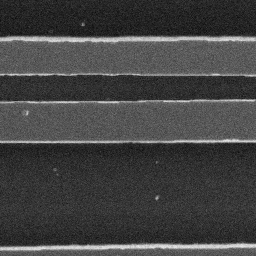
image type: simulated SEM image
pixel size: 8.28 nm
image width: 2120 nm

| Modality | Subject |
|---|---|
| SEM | lines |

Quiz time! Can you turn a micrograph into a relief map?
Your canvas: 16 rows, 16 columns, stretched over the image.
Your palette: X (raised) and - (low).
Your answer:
----------------
----------------
----------------
XXXXXXXXXXXXXXXX
XXXXXXXXXXXXXXXX
XXXXXXXXXXXXXXXX
XXXXXXXXXXXXXXXX
XXXXXXXXXXXXXXXX
XXXXXXXXXXXXXXXX
----------------
----------------
----------------
----------------
----------------
----------------
--------XXXXXXXX